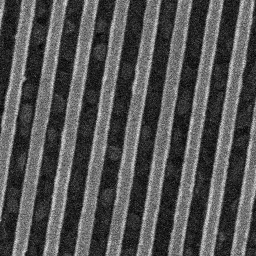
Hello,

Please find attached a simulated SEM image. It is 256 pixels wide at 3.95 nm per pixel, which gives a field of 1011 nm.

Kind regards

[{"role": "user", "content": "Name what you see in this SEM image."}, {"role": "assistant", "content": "parallel lines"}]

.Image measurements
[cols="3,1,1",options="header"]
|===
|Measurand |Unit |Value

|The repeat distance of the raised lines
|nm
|122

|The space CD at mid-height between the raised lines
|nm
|66.8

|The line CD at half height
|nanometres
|55.1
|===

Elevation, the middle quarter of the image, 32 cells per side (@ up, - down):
---@@@----@@@@----@@@@----@@@---
--@@@@----@@@-----@@@-----@@@---
--@@@@----@@@-----@@@-----@@@---
--@@@@----@@@-----@@@-----@@@---
--@@@-----@@@----@@@@----@@@@---
--@@@-----@@@----@@@@----@@@@---
--@@@----@@@@----@@@@----@@@----
-@@@@----@@@@----@@@-----@@@----
-@@@@----@@@-----@@@-----@@@----
-@@@-----@@@-----@@@-----@@@----
-@@@-----@@@-----@@@----@@@@----
-@@@-----@@@----@@@@----@@@-----
-@@@-----@@@----@@@@----@@@-----
@@@@----@@@-----@@@-----@@@-----
@@@-----@@@-----@@@-----@@@-----
@@@-----@@@-----@@@-----@@@----@
@@@-----@@@-----@@@----@@@@----@
@@@-----@@@----@@@@----@@@@----@
@@@----@@@@----@@@@----@@@@----@
@@@----@@@@----@@@@----@@@@----@
@@@----@@@@----@@@-----@@@-----@
@@@----@@@-----@@@-----@@@----@@
@@-----@@@-----@@@----@@@@----@@
@@-----@@@----@@@@----@@@@----@@
@@----@@@@----@@@@----@@@@----@@
@@----@@@@----@@@@----@@@-----@@
@@----@@@-----@@@-----@@@-----@@
@-----@@@-----@@@-----@@@----@@@
@-----@@@-----@@@----@@@@----@@@
@----@@@@----@@@@----@@@@----@@@
@-----@@@----@@@@----@@@@----@@@
@----@@@@----@@@@----@@@-----@@@